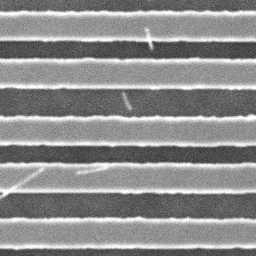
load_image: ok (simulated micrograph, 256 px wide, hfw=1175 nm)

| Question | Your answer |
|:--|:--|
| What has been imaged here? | lines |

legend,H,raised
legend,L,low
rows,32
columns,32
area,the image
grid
LLLLLLLLLLLLLLLLLLLLLLLLLLLLLLLL
LLHHHLHLLLLHHHLLLHHHHHLHHHHLHLHH
HHHHHHHHHHHHHHHHHHHHHHHHHHHHHHHH
HHHHHHHHHHHHHHHHHHHHHHHHHHHHHHHH
HHHHHHHHHHHHHHHHHHHHHHHHHHHHHHHH
LLLLLLLLLLLLLLLLLLLLLLLLLLLLLLLL
LLLLLLLLLLLLLLLLLLLLLLLLLLLLLLLL
HHHHHHHHHHHHHHHHHHHHHHHHHHHHHHHH
HHHHHHHHHHHHHHHHHHHHHHHHHHHHHHHH
HHHHHHHHHHHHHHHHHHHHHHHHHHHHHHHH
HHHHHHHHHHHHHHHHHHHHHHHHHHHHHHHH
LLLLLLLLLLLLLLLLLLLLLLLLLLLLLLLL
LLLLLLLLLLLLLLLLLLLLLLLLLLLLLLLL
LLLLLLLLLLLLLLLLLLLLLLLLLLLLLLLL
LLLLLLLLLLLLLLLLLLLLLLLLLLLLLLLL
HHHHHHHHHHHHHHHHHHHHHHHHHHHHHHHH
HHHHHHHHHHHHHHHHHHHHHHHHHHHHHHHH
HHHHHHHHHHHHHHHHHHHHHHHHHHHHHHHH
LLLLLLLLLLLLLLLLLLLLLLLLLLLLLLLL
LLLLLLLLLLLLLLLLLLLLLLLLLLLLLLLL
HHHHHHHHLLLHHHHHHHHHHHHHLLLLLLHH
HHHHHHHHHHHHHHHHHHHHHHHHHHHHHHHH
HHHHHHHHHHHHHHHHHHHHHHHHHHHHHHHH
HHHHHHHHHHHHHHHHHHHHHHHHHHHHHHHH
LLLLLLLLLLLLLLLLLLLLLLLLLLLLLLLL
LLLLLLLLLLLLLLLLLLLLLLLLLLLLLLLL
LLLLLLLLLLLLLLLLLLLLLLLLLLLLLLLL
HHHHHHHHHHHHHHHHHHHHHHHHHHHHHHHH
HHHHHHHHHHHHHHHHHHHHHHHHHHHHHHHH
HHHHHHHHHHHHHHHHHHHHHHHHHHHHHHHH
HHHHHHHHHHHHHHHHHHHHHHHHHHHHHHHH
LLLLLLLLLLLLLLLLLLLLLLLLLLLLLLLL